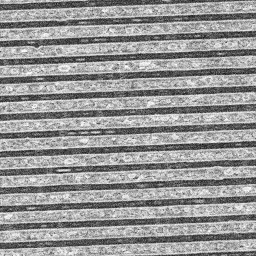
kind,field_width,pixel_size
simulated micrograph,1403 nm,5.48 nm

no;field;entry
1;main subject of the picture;parallel lines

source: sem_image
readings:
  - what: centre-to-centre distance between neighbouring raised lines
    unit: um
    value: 0.1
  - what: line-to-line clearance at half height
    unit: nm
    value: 41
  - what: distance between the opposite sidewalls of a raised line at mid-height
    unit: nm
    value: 61.6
